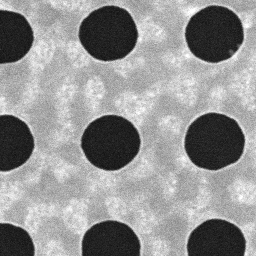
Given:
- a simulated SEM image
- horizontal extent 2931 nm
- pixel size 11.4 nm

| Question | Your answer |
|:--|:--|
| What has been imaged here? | holes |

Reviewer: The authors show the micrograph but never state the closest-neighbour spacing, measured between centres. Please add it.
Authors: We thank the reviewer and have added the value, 105 px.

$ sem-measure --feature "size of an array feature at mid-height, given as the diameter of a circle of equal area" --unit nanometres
666